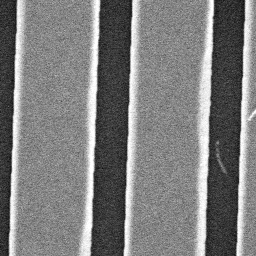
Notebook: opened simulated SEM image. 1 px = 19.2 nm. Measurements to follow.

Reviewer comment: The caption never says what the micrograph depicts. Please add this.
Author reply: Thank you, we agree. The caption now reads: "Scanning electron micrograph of lines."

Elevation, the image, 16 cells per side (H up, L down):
LHHHHHLLHHHHHLLH
LHHHHHLLHHHHHLLH
LHHHHHLLHHHHHLLH
LHHHHHLLHHHHHLLH
LHHHHHLLHHHHHLLH
LHHHHHLLHHHHHLLH
LHHHHHLLHHHHHLLH
LHHHHHLLHHHHHLLH
LHHHHHLLHHHHHLLH
LHHHHHLLHHHHHLLH
LHHHHHLLHHHHHLLH
LHHHHHLLHHHHHLLH
LHHHHHLLHHHHHLLH
LHHHHHLLHHHHHLLH
LHHHHHLLHHHHHLLH
LHHHHHLLHHHHHLLH